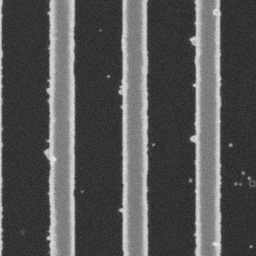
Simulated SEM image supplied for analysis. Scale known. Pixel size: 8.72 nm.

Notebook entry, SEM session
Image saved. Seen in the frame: lines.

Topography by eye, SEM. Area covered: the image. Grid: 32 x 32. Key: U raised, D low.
DDDDDDUUUDDDDDDUUUDDDDDDDUUDDDDD
DDDDDDUUUDDDDDDUUUDDDDDDDUUDDDDD
DDDDDDUUUDDDDDDUUUDDDDDDDUUDDDDD
DDDDDDUUUDDDDDDUUUDDDDDDDUUDDDDD
DDDDDDUUUDDDDDDUUUDDDDDDDUUDDDDD
DDDDDDUUUDDDDDDUUUDDDDDDDUUDDDDD
DDDDDDUUUDDDDDDUUUDDDDDDDUUDDDDD
DDDDDDUUUDDDDDDDUUDDDDDDDUUDDDDD
DDDDDDUUUDDDDDDUUUDDDDDDDUUDDDDD
DDDDDDUUUDDDDDDUUUDDDDDDDUUDDDDD
DDDDDDUUUDDDDDDUUUDDDDDDDUUDDDDD
DDDDDDUUUDDDDDDUUUDDDDDDDUUDDDDD
DDDDDDUUUDDDDDDUUUDDDDDDDUUDDDDD
DDDDDDUUUDDDDDDUUUDDDDDDDUUDDDDD
DDDDDDUUUDDDDDDUUUDDDDDDDUUDDDDD
DDDDDDUUUDDDDDDDUUDDDDDDDUUDDDDD
DDDDDDUUUDDDDDDDUUDDDDDDDUUDDDDD
DDDDDDUUUDDDDDDDUUDDDDDDDUUDDDDD
DDDDDDUUUDDDDDDDUUDDDDDDDUUDDDDD
DDDDDDUUUDDDDDDDUUDDDDDDDUUDDDDD
DDDDDDUUUDDDDDDDUUDDDDDDDUUDDDDD
DDDDDDUUUDDDDDDUUUDDDDDDDUUDDDDD
DDDDDDUUUDDDDDDDUUDDDDDDDUUDDDDD
DDDDDDUUUDDDDDDDUUDDDDDDDUUDDDDD
DDDDDDUUUDDDDDDUUUDDDDDDDUUDDDDD
DDDDDDUUUDDDDDDDUUDDDDDDDUUDDDDD
DDDDDDUUUDDDDDDDUUDDDDDDDUUDDDDD
DDDDDDUUUDDDDDDDUUDDDDDDDUUDDDDD
DDDDDDUUUDDDDDDUUUDDDDDDDUUDDDDD
DDDDDDUUUDDDDDDUUUDDDDDDDUUDDDDD
DDDDDDUUUDDDDDDDUUDDDDDDDUUDDDDD
DDDDDDDUUDDDDDDDUUDDDDDDDUUDDDDD